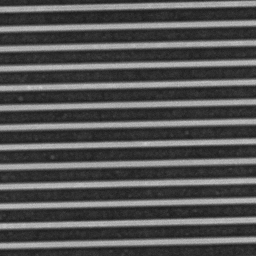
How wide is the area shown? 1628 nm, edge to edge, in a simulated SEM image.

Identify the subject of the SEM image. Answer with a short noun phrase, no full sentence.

parallel lines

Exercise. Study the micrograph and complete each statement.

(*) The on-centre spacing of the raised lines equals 125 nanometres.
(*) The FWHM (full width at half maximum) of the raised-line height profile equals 0.0366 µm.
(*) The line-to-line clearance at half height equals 0.0858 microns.